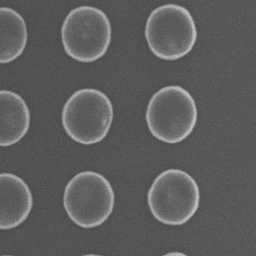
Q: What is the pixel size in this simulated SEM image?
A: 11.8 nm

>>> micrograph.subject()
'raised bodies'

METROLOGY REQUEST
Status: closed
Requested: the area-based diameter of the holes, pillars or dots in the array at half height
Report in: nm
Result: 594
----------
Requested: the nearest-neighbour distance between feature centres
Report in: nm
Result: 970